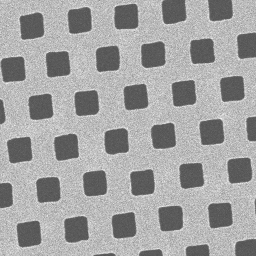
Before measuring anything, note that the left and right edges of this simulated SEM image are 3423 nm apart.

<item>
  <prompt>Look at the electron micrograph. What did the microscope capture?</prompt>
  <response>a regular array of holes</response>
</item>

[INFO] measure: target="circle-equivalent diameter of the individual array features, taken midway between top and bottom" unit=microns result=0.36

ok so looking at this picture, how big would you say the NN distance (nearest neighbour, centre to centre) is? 617 nm